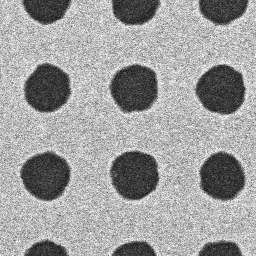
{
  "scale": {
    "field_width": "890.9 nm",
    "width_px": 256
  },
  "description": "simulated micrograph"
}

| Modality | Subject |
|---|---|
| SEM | holes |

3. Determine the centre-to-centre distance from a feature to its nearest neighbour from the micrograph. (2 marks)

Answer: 0.303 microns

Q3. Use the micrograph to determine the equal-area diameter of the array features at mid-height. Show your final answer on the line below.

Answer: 168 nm